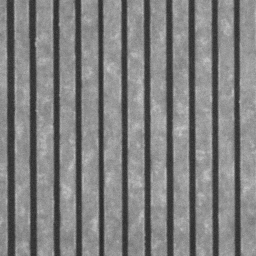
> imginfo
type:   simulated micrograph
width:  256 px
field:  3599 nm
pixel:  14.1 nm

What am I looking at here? parallel lines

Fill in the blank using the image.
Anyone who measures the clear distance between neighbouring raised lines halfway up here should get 7.38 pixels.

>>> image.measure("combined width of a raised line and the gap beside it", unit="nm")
319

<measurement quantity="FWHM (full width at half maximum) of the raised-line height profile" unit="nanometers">220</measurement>